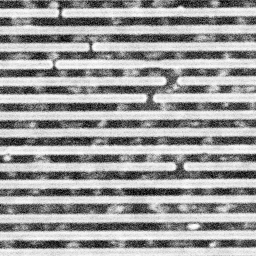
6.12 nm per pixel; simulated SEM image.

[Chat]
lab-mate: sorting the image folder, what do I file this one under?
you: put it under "parallel lines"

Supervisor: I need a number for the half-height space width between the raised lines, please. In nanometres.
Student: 64.3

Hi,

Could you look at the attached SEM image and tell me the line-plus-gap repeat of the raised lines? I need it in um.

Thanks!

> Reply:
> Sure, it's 0.105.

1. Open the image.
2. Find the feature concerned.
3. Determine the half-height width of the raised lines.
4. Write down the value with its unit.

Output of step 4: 0.0413 micrometres